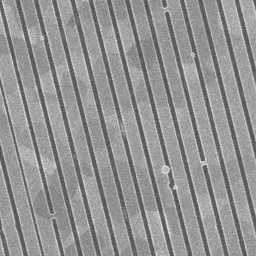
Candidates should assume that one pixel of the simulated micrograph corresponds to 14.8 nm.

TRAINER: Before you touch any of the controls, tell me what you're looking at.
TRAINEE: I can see parallel lines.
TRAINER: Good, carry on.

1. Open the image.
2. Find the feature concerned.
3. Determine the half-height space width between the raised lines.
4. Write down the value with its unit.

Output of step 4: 79.3 nanometres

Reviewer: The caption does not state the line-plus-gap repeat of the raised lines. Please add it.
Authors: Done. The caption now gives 263 nanometres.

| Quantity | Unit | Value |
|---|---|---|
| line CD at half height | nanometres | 184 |